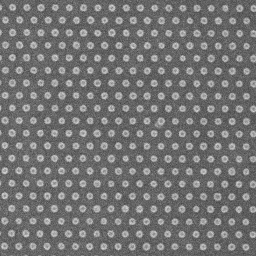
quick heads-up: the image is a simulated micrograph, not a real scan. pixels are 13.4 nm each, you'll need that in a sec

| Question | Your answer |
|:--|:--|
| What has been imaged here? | a regular array of raised bodies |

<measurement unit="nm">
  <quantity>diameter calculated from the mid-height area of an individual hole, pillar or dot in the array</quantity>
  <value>82.5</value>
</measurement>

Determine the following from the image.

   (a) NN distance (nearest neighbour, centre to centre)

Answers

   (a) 13.8 px